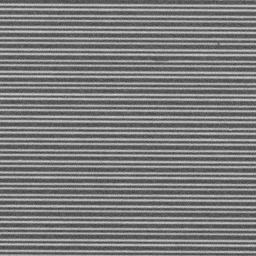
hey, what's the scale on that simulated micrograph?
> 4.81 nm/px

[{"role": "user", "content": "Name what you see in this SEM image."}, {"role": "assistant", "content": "parallel lines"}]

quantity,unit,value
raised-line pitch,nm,26.9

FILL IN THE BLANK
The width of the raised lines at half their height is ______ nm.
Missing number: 9.6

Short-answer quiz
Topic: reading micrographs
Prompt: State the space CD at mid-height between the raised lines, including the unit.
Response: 2.99 pixels